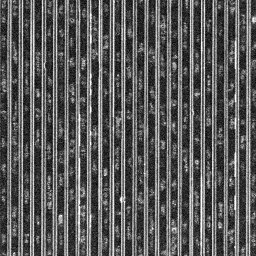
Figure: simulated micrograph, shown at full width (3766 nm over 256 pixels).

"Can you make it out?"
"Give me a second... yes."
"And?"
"parallel lines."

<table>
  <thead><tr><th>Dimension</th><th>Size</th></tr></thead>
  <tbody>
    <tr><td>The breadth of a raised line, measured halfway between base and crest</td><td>42.3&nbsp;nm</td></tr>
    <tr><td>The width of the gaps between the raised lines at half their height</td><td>8.38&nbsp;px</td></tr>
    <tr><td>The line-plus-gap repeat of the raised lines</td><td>168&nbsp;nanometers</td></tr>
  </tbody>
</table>